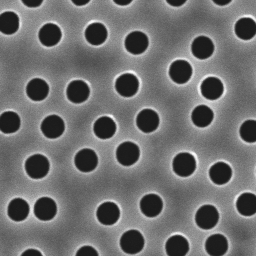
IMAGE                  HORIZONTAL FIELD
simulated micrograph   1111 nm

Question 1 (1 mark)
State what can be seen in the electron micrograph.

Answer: a regular array of holes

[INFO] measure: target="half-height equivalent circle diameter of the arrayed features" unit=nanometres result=102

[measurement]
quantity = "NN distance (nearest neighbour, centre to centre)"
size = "0.162 micrometres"